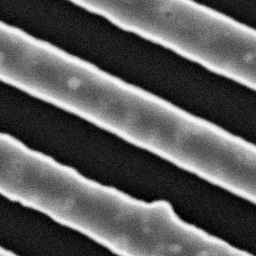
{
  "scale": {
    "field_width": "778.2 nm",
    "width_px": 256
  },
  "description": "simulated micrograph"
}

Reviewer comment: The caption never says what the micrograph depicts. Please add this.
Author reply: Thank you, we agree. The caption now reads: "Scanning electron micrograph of one or a few lines or trenches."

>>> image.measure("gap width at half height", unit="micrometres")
0.158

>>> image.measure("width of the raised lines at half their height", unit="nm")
149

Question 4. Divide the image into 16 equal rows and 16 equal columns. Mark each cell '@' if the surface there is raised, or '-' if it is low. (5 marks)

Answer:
-----@@@@@@@@---
-------@@@@@@@@-
@@--------@@@@@@
@@@@--------@@@@
@@@@@@--------@@
-@@@@@@@--------
----@@@@@@------
------@@@@@@----
--------@@@@@@--
@@--------@@@@@@
@@@@--------@@@@
@@@@@@--------@@
-@@@@@@@--------
---@@@@@@@@-----
-----@@@@@@@@---
-------@@@@@@@@-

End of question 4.